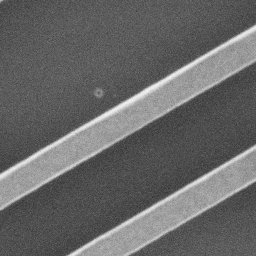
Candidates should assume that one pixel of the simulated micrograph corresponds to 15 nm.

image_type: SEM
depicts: lines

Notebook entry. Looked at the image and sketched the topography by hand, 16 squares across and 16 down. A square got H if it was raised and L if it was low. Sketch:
LLLLLLLLLLLLLLLL
LLLLLLLLLLLLLLLL
LLLLLLLLLLLLLLHH
LLLLLLLLLLLLLHHH
LLLLLLLLLLLHHHHL
LLLLLLLLLHHHHLLL
LLLLLLLLHHHLLLLL
LLLLLLHHHHLLLLLL
LLLLHHHHLLLLLLLL
LLHHHHLLLLLLLLLH
LHHHLLLLLLLLLLHH
HHHLLLLLLLLLHHHH
HLLLLLLLLLHHHHLL
LLLLLLLLHHHHLLLL
LLLLLLLHHHLLLLLL
LLLLLHHHHLLLLLLL